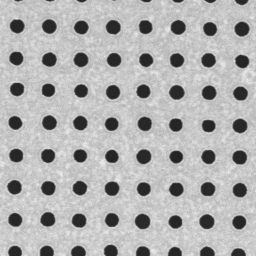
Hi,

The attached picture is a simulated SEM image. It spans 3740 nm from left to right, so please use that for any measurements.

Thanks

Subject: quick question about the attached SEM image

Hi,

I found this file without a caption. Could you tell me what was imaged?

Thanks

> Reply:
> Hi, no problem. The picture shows a regular array of holes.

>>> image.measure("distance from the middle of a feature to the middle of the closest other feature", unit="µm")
0.46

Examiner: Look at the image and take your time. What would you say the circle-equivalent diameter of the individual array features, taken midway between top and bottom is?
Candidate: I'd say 213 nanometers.